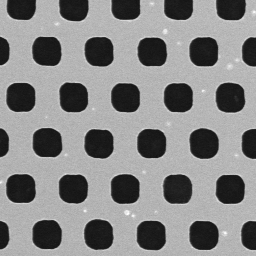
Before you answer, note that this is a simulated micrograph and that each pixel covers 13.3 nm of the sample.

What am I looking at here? a regular array of holes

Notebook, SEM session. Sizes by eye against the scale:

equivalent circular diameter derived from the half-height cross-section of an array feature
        411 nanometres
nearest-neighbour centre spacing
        0.694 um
